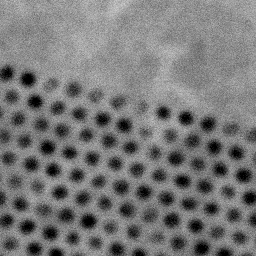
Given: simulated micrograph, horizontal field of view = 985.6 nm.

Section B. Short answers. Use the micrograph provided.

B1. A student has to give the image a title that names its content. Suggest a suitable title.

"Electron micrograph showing a regular array of holes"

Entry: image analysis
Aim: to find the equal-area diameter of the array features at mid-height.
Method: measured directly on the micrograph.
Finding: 60.9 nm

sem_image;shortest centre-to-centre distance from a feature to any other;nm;88.4